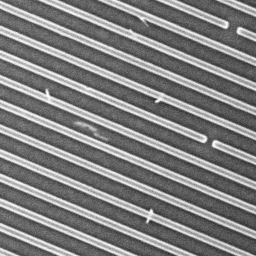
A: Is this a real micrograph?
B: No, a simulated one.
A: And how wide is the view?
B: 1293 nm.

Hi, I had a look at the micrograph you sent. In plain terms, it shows parallel lines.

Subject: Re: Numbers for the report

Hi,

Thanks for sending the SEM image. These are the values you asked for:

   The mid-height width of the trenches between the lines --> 0.0844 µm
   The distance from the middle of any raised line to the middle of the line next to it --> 115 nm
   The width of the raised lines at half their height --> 6.46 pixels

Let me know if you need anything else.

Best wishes